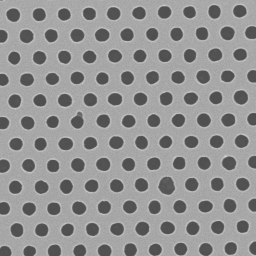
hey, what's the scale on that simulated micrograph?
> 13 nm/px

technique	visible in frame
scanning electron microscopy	a regular array of holes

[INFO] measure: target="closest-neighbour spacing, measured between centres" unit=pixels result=24.5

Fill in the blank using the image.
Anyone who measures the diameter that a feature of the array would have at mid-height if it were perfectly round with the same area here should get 0.172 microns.